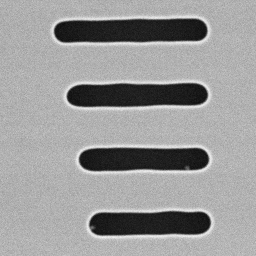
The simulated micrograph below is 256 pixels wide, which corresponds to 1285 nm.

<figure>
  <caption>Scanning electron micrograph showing groups of lines, slits or small figures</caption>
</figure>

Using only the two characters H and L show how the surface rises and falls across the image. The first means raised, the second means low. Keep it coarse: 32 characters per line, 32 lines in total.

HHHHHHHHHHHHHHHHHHHHHHHHHHHHHHHH
HHHHHHHHHHHHHHHHHHHHHHHHHHHHHHHH
HHHHHHHHHLLLLLLLLLLLLLLLLHHHHHHH
HHHHHHHLLLLLLLLLLLLLLLLLLLHHHHHH
HHHHHHHLLLLLLLLLLLLLLLLLLLHHHHHH
HHHHHHHHHHHHHHHHHHHHHHHHHHHHHHHH
HHHHHHHHHHHHHHHHHHHHHHHHHHHHHHHH
HHHHHHHHHHHHHHHHHHHHHHHHHHHHHHHH
HHHHHHHHHHHHHHHHHHHHHHHHHHHHHHHH
HHHHHHHHHHHHHHHHHHHHHHHHHHHHHHHH
HHHHHHHHHHHHHHLLHHHHHHLLLHHHHHHH
HHHHHHHHHLLLLLLLLLLLLLLLLLHHHHHH
HHHHHHHHLLLLLLLLLLLLLLLLLLHHHHHH
HHHHHHHHHHHHHHHHHHHHHHHHHHHHHHHH
HHHHHHHHHHHHHHHHHHHHHHHHHHHHHHHH
HHHHHHHHHHHHHHHHHHHHHHHHHHHHHHHH
HHHHHHHHHHHHHHHHHHHHHHHHHHHHHHHH
HHHHHHHHHHHHHHHHHHHHHHHHHHHHHHHH
HHHHHHHHHHHHLLLLLLLHHHHHLHHHHHHH
HHHHHHHHHHLLLLLLLLLLLLLLLLHHHHHH
HHHHHHHHHHLLLLLLLLLLLLLLLLHHHHHH
HHHHHHHHHHHHHHHHHHHHHHHHHHHHHHHH
HHHHHHHHHHHHHHHHHHHHHHHHHHHHHHHH
HHHHHHHHHHHHHHHHHHHHHHHHHHHHHHHH
HHHHHHHHHHHHHHHHHHHHHHHHHHHHHHHH
HHHHHHHHHHHHHHHHHHHHHHHHHHHHHHHH
HHHHHHHHHHHHHHHHHHHHLLLLLHHHHHHH
HHHHHHHHHHHLLLLLLLLLLLLLLLHHHHHH
HHHHHHHHHHHLLLLLLLLLLLLLLLHHHHHH
HHHHHHHHHHHHHLLLHHHHHHHHHHHHHHHH
HHHHHHHHHHHHHHHHHHHHHHHHHHHHHHHH
HHHHHHHHHHHHHHHHHHHHHHHHHHHHHHHH